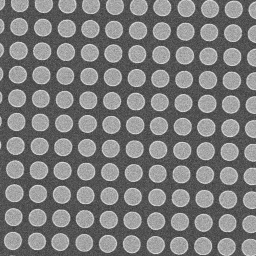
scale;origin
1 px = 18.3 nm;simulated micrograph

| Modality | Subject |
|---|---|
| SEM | an array of small figures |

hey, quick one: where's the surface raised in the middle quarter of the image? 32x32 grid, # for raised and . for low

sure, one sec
................................
##...###...###...##.............
##..####..####..####..####...###
##..####..####..####..####..####
##...###..####..####..####..####
.................##....##....##.
................................
##...###...##....##....##.......
##..####..####..####..####..####
##..####..####..####..####..####
##..####..####..####..####..####
.......................##....##.
................................
##..###....##....##....#........
##..####..####..####..####..####
##..####..####..####..####..####
#...###...####..####..####..####
.......................##....##.
................................
##..###...###...###....##.......
##..####..####..####..###...###.
##..####..####..####.#####.#####
#...###...###...###...###...####
.......................#....###.
................................
#...###...###...###...##........
##.#####..####.####...###..####.
##.#####.#####.#####.####..####.
#...###...###...###...###..####.
.......................#....##..
................................
#...###...###...##....##....##..